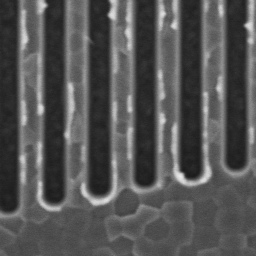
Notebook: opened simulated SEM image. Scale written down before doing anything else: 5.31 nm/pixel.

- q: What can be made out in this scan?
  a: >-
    parallel lines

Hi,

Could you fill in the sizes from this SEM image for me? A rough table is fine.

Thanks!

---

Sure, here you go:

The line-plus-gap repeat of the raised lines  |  243 nm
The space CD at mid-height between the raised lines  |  24.1 pixels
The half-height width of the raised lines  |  0.115 microns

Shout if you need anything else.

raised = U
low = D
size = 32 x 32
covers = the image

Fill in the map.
DDDUUUDDUUUDDDUUUDDDUUDDDUUUDDDU
DDUUUDDDUUUDDDUUUDDDUUDDDUUUDDDU
DDUUUDDDUUUDDDUUUDDDUUDDDUUUDDDU
DDUUUDDDUUUDDDUUUDDDUUDDDUUUDDDU
DDUUUDDDUUUDDDUUUDDDUUDDDUUUDDDU
DDUUUDDDUUUDDDUUUDDDUUDDDUUUDDDU
DDUUUDDDUUUDDDUUUDDDUUDDDUUUDDDU
DDUUUDDDUUUDDDUUUDDDUUDDDUUUDDDU
DDUUUDDDUUUDDDUUUDDDUUDDDUUUDDDU
DDUUUDDDUUUDDDUUUDDDUUDDDUUUDDDU
DDUUUDDDUUUDDDUUUDDDUUDDDUUUDDDU
DDUUUDDDUUUDDDUUUDDDUUDDDUUUDDDU
DDUUUDDDUUUDDDUUUDDDUUDDDUUUDDDU
DDUUUDDDUUUDDDUUUDDDUUDDDUUUDDDU
DDUUUDDDUUUDDDUUUDDDUUDDDUUUDDDU
DDUUUDDDUUUDDDUUUDDDUUDDDUUUDDDU
DDDUUDDDUUUDDDUUUDDDUUDDDUUUDDDU
DDDUUDDDUUUDDDUUUDDDUUDDDUUUDDDU
DDDUUDDDUUUDDDUUUDDDUUDDDUUUDDDU
DDUUUDDDUUUDDDUUUDDDUUDDDUUUDDDU
DDUUUDDDUUUDDDUUUDDDUUDDDUUUDDDU
DDUUUDDDUUUDDDUUUDDDUUUDDUUUUDUU
DDUUUDDDUUUDDDUUUDDDUUUDUUUUUUUU
DDUUUDDDUUUDDDUUUUUUUUUUUUUUUUUU
DDUUUDDDUUUUDUUUUUUUUUUUUUUUUUUU
DDUUUUDDUUUUUUUUUUUUUUUUUUUUUUUU
DDUUUUUUUUUUUUUUUUUUUUUUUUUUUUUU
UUUUUUUUUUUUUUUUUUUUUUUUUUUUUUUU
UUUUUUUUUUUUUUUUUUUUUUUUUUUUUUUU
UUUUUUUUUUUUUUUUUUUUUUUUUUUUUUUU
UUUUUUUUUUUUUUUUUUUUUUUUUUUUUUUU
UUUUUUUUUUUUUUUUUUUUUUUUUUUUUUUU